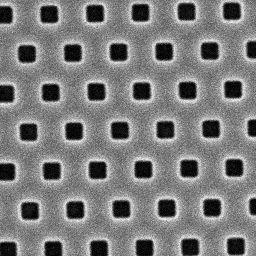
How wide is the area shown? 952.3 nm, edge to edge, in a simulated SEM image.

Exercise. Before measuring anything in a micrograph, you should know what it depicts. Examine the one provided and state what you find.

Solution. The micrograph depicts a regular array of holes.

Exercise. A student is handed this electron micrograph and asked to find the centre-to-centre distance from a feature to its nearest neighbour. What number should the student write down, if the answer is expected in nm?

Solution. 168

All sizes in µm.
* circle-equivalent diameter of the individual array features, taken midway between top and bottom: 0.0747